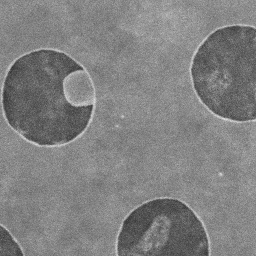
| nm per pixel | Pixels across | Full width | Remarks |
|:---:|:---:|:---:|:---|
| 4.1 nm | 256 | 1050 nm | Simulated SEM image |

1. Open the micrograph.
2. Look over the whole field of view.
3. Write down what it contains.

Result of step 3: holes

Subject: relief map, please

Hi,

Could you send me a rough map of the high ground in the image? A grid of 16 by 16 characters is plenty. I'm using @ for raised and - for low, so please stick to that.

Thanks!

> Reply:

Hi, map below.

@@@@@@@@@@@@@@@@
@@@@@@@@@@@@@@@@
@@@@@@@@@@@@@---
@---@@@@@@@@----
@----@@@@@@@----
----@@@@@@@@----
------@@@@@@@---
------@@@@@@@@--
@----@@@@@@@@@@@
@@@@@@@@@@@@@@@@
@@@@@@@@@@@@@@@@
@@@@@@@@@@@@@@@@
@@@@@@@@@@-@@@@@
@@@@@@@@----@@@@
-@@@@@@------@@@
-@@@@@@------@@@